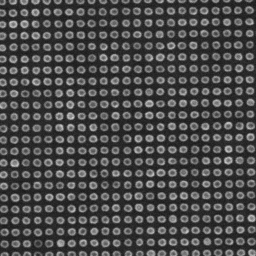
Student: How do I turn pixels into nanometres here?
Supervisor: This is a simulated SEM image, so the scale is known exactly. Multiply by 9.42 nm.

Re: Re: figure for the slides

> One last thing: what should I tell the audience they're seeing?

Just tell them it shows a regular array of raised bodies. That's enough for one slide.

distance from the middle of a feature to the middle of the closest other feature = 104 nm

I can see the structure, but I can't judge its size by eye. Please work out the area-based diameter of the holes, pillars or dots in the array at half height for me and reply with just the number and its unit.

0.0655 um